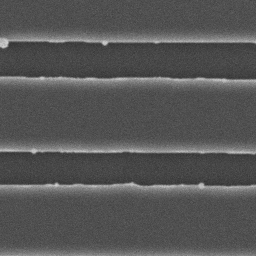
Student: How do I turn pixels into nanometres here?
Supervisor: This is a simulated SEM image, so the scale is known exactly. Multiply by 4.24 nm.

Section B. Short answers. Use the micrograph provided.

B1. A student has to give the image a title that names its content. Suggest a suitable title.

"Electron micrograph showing lines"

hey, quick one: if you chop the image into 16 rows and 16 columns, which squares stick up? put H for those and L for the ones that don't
HHHHHHHHHHHHHHHH
HHHHHHHHHHHHHHHH
HHHHHHHHHHHHHHHH
LLLLLLLLLLLLLLLL
LLLLLLLLLLLLLLLL
HHHHHHHHHHHHHHHH
HHHHHHHHHHHHHHHH
HHHHHHHHHHHHHHHH
HHHHHHHHHHHHHHHH
LHHHHHHHHHHHHHHH
LLLLLLLLLLLLLLLL
LLLLLLLLLLLLLLLL
HHHHHHHHHHHHHHHH
HHHHHHHHHHHHHHHH
HHHHHHHHHHHHHHHH
HHHHHHHHHHHHHHHH